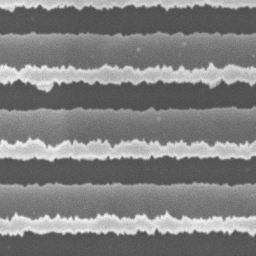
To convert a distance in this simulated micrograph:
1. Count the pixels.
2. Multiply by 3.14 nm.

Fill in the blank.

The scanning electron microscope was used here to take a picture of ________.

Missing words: lines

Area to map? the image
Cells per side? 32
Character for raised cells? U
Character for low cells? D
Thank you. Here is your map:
UUUUUUUUUUUUUUUUUUUUUUUUUUUUUUUU
DDDDDDDDDDDDDDDDDDDDDDDDDDDDDDDD
DDDDDDDDDDDDDDDDDDDDDDDDDDDDDDDD
DDDDDDDDDDDDDDDDDDDDDDDDDDDDDDDD
UUUUUUUUUUUUUUUDUUUUUUUUUUUUUUUU
UUUUUUUUUUUUUUUUUUUUUUUUUUUUUUUU
UUUUUUUUUUUUUUUUUUUUUUUUUUUUUUUU
UUUUUUUUUUUUUUUUUUUUUUUUUUUUUUUU
UUUUUUUUUUUUUUUUUUUUUUUUUUUUUUUU
UUUUUUUUUUUUUUUUUUUUUUUUUUUUUUUU
DDDDUUUDDDDDDDDDDDDDDDDDDDUDDDDU
DDDDDDDDDDDDDDDDDDDDDDDDDDDDDDDD
DDDDDDDDDDDDDDDDDDDDDDDDDDDDDDDD
DDDDDDDDDDDDDDDDDDDDDDDDDDDDUUDU
UUUUUUUUUUUUUUUUUUUUUUUUUUUUUUUU
UUUUUUUUUUUUUUUUUUUUUUUUUUUUUUUU
UUUUUUUUUUUUUUUUUUUUUUUUUUUUUUUU
UUUUUUUUUUUUUUUUUUUUUUUUUUUUUUUU
UUUUUUUUUUUUUUUUUUUUUUUUUUUUUUUU
UUUUUUUUUUUUUUUUUUUUUUUUUUUUUUUU
DDDDDDDDDDDDDDDDDDDDDDDDDDDDDDDD
DDDDDDDDDDDDDDDDDDDDDDDDDDDDDDDD
DDDDDDDDDDDDDDDDDDDDDDDDDDDDDDDD
UUUUUUUUUUUUUUUUUUUUUUUUUUUUUUUU
UUUUUUUUUUUUUUUUUUUUUUUUUUUUUUUU
UUUUUUUUUUUUUUUUUUUUUUUUUUUUUUUU
UUUUUUUUUUUUUUUUUUUUUUUUUUUUUUUU
UUUUUUUUUUUUUUUUUUUUUUUUUUUUUUUU
UUUUUUUUUUUUUUUUUUUUUUUUUUUUUUUU
DDDDDDDDDDDDDDDDDDDDDDDDDDDDDDDD
DDDDDDDDDDDDDDDDDDDDDDDDDDDDDDDD
DDDDDDDDDDDDDDDDDDDDDDDDDDDDDDDD